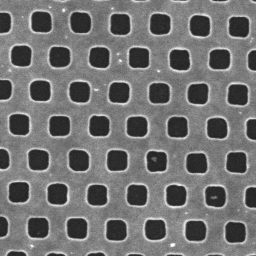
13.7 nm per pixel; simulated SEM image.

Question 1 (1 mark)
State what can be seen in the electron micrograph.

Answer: a regular array of holes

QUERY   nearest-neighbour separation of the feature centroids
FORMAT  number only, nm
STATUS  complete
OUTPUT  529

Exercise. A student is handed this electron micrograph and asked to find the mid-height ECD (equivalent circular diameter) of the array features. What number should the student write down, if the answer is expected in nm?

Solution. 306